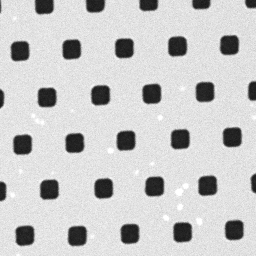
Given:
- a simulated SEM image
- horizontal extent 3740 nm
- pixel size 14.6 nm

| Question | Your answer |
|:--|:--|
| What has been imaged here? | a regular array of holes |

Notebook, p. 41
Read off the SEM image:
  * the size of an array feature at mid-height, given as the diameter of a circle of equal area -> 309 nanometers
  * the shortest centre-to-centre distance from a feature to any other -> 759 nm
